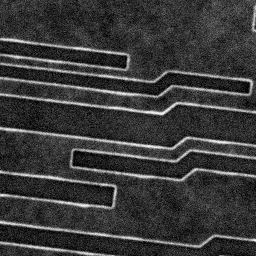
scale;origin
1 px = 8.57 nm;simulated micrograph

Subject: groups of lines, slits or small figures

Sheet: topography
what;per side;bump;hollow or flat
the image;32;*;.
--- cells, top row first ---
********************************
********************************
********************************
********************************
********************************
....****************************
.............*******************
******..........****************
.....**********.****************
.............*******......******
*******........................*
**************......********...*
.....***************************
.............********......*****
................................
................................
*****...........................
*************..........***......
********************************
*********.......*******......***
*********.......................
***************.........****....
........************************
..............******************
**............******************
*********.....******************
********************************
********************************
.....***************************
..............******************
**....................***.......
**********......................